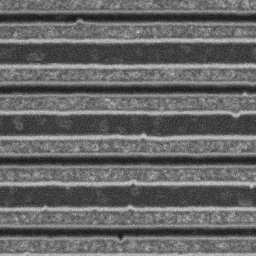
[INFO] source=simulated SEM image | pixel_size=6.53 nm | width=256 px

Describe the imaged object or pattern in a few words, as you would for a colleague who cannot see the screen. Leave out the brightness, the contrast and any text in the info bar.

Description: parallel lines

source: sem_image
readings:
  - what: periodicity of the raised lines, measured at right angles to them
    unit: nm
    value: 236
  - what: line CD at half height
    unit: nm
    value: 117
